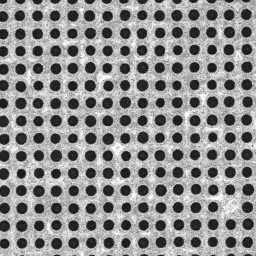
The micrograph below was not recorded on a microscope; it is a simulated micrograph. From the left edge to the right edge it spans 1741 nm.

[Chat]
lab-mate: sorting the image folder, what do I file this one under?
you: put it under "a regular array of holes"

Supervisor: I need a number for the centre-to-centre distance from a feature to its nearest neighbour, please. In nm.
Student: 116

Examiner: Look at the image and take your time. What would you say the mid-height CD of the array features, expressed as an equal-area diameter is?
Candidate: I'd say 76.4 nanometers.